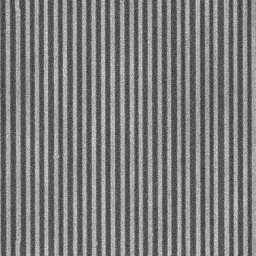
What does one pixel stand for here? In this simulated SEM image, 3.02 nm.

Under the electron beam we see parallel lines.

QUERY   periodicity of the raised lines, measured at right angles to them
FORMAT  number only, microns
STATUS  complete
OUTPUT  0.0286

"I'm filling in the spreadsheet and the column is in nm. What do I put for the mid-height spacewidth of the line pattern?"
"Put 17.4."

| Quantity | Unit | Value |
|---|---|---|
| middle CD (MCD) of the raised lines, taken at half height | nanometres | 11.7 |